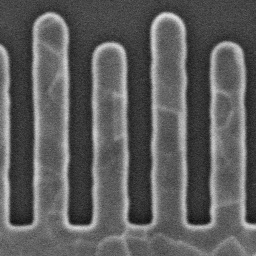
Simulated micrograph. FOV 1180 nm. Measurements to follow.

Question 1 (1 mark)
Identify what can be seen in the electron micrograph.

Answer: groups of lines, slits or small figures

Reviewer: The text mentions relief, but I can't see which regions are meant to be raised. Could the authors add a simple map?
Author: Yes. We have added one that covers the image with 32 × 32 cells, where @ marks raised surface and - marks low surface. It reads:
--------------------------------
--------------------------------
-----@@@-----------@@@@---------
----@@@@-----------@@@@---------
----@@@@-----------@@@@---------
----@@@@-----@-----@@@@-----@---
@---@@@@----@@@@---@@@@----@@@--
@---@@@@----@@@@---@@@@----@@@--
@---@@@@----@@@@---@@@@---@@@@@-
@---@@@@----@@@@---@@@@---@@@@@-
@---@@@@----@@@@---@@@@----@@@@-
@---@@@@----@@@@---@@@@----@@@--
@---@@@@----@@@@---@@@@---@@@@--
@---@@@@----@@@@---@@@@---@@@@--
@---@@@@----@@@@---@@@@---@@@@--
@---@@@@----@@@@---@@@@---@@@@@-
@---@@@@----@@@@---@@@@---@@@@@-
@---@@@@----@@@@---@@@@---@@@@--
@---@@@@----@@@@---@@@@----@@@@-
@---@@@@@---@@@@---@@@@----@@@@-
@---@@@@----@@@@---@@@@----@@@@-
@---@@@@----@@@@---@@@@---@@@@@-
@---@@@@----@@@@---@@@@---@@@@@-
@---@@@@----@@@@---@@@@---@@@@--
@---@@@@----@@@@---@@@@---@@@@@-
@---@@@@----@@@@---@@@@---@@@@--
@---@@@@----@@@@---@@@@---@@@@--
@---@@@@----@@@@---@@@@---@@@@@-
@@@@@@@@@@@@@@@@@@@@@@@@@@@@@@@@
@@@@@@@@@@@@@@@@@@@@@@@@@@@@@@@@
@@@@@@@@@@@@@@@@@@@@@@@@@@@@@@@@
@@@@@@@@@@@@@@@@@@@@@@@@@@@@@@@@